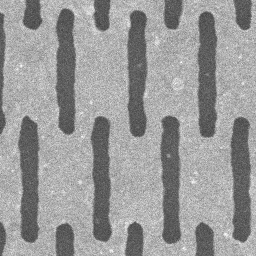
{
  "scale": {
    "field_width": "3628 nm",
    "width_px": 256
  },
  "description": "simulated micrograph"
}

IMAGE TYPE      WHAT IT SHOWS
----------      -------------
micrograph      holes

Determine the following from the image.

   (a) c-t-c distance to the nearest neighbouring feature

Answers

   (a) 994 nanometres